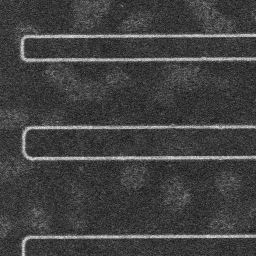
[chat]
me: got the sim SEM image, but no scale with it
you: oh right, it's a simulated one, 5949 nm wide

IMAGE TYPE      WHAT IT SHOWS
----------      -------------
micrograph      one or a few lines or trenches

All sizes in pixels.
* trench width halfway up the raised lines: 74.1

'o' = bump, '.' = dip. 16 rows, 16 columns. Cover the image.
................
................
..oooooooooooooo
..oooooooooooooo
................
................
................
................
..oooooooooooooo
..oooooooooooooo
................
................
................
................
................
..oooooooooooooo